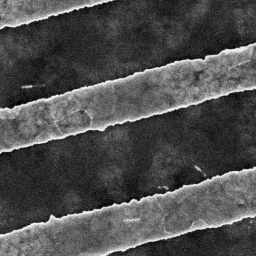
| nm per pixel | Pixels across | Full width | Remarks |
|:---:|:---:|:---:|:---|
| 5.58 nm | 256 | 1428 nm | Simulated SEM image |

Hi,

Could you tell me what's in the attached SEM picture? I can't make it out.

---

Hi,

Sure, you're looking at one or a few lines or trenches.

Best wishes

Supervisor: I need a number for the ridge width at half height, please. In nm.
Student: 243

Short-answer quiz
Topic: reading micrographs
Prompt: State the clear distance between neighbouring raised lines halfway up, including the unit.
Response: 431 nanometres